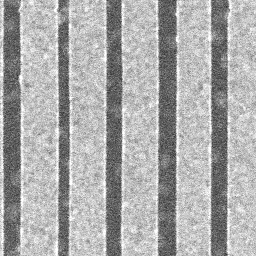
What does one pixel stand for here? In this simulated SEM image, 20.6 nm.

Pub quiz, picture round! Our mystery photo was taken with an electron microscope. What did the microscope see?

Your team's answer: parallel lines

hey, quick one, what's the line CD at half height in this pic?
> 35.5 px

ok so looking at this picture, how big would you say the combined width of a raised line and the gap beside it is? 1060 nm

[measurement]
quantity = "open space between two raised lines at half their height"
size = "360 nm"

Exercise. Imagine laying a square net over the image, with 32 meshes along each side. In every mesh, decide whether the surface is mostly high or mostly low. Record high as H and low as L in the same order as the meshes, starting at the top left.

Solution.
LLLHHHHLHHHHHLLHHHHHLLHHHHLLLHHH
LLLHHHHLHHHHHLLHHHHHLLHHHHLLHHHH
LLLHHHHHLHHHHLLHHHHHLLHHHHLLHHHH
LLLHHHHLLHHHHLLHHHHHLLHHHHLLLHHH
LLLHHHHLLHHHHLLHHHHHLLHHHHLLLHHH
LLLHHHHLLHHHHLLHHHHHLLHHHHLLLHHH
LLLHHHHLLHHHHLLHHHHHLLHHHHLLLHHH
LLLHHHHLLHHHHLLHHHHHLLHHHHLLLHHH
LLLHHHHLLHHHHLLHHHHHLLHHHHLLLHHH
LLHHHHHLLHHHHLLHHHHHLLHHHHLLLHHH
LLLHHHHLLHHHHLLHHHHHLLHHHHLLLHHH
LLLHHHHLLHHHHLLHHHHHLLHHHHLLLHHH
LLLHHHHLLHHHHLLHHHHHLLHHHHLLLHHH
LLLHHHHLLHHHHLLHHHHHLLHHHHLLLHHH
LLLHHHHLLHHHHLLHHHHHLLHHHHLLLHHH
LLLHHHHLLHHHHLLHHHHHLLHHHHLLLHHH
LLLHHHHLLHHHHLLHHHHHLLHHHHLLLHHH
LLLHHHHLLHHHHLLHHHHHLLHHHHLLLHHH
LLLHHHHLLHHHHLLHHHHHLLHHHHLLLHHH
LLLHHHHLLHHHHLLHHHHHLLHHHHLLLHHH
LLLHHHHLLHHHHLLHHHHHLLHHHHLLLHHH
LLLHHHHLLHHHHLLHHHHHLLHHHHLLLHHH
LLLHHHHLLHHHHLLHHHHHLLHHHHLLLHHH
LLLHHHHLLHHHHLLHHHHHLLHHHHLLLHHH
LLLHHHHLLHHHHLLHHHHHLLHHHHLLLHHH
LLLHHHHLLHHHHLLHHHHHLLHHHHLLLHHH
LLLHHHHLLHHHHLLHHHHHLLHHHHLLLHHH
LLLHHHHLLHHHHLLHHHHHLLHHHHLLHHHH
LLLHHHHLLHHHHLLHHHHHLLHHHHLLHHHH
LLLHHHHLLHHHHLLHHHHHLLHHHHLLLHHH
LLHHHHHLLHHHHLLHHHHHLLHHHHLLHHHH
LLHHHHHLHHHHHLLHHHHHLLHHHHLLHHHH